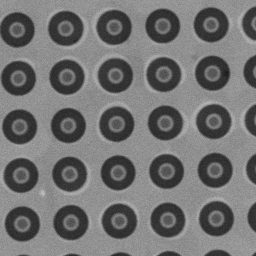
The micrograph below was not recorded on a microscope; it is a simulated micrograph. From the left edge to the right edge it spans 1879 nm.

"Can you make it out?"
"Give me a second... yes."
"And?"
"an array of small figures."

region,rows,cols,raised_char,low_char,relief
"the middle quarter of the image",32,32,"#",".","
....#####........####........###
.....###....##...###....##....##
##....##...###...###...####...##
##....##...####..###...####...##
##...###.........####........###
.....####........####.......####
....######.....#######.....#####
..##########.###################
################################
################################
###########....#########...#####
...#######......######......####
.....####........####.........##
.....####....#...####...###...##
###...##...####...###...###...##
###...##...####...###...###....#
##...####...##...####....#....##
.....####........#####.......###
....######......#######.....####
...##########.##################
################################
################################
#########################...####
...########.....#######......###
.....#####.......#####.......###
......###.........###....##...##
###...###...###...###...###...##
###...###...###...###...###...##
###...###...###...####...#....##
......####.......#####.......###
.....######.....#######.....####
....########...#################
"